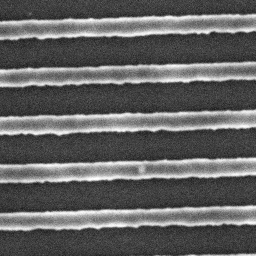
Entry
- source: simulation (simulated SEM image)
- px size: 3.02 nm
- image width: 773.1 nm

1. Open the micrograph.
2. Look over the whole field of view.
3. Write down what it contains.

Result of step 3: lines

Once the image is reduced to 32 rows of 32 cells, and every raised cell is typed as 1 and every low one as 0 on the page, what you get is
00000000000000000000000000000000
00000000000000000000000000000000
00000001111111111111111111111111
11111111111111111111111111111111
11111111110000000000000000000000
00000000000000000000000000000000
00000000000000000000000000000000
00000000000000000000000000000000
00000000001111111111111111111111
11111111111111111111111111111111
11111111010000000000000000000000
00000000000000000000000000000000
00000000000000000000000000000000
00000000000000000000000000000000
00000000011111111111111111111111
11111111111111111111111111111111
11111111111000000000000000000000
00000000000000000000000000000000
00000000000000000000000000000000
00000000000000000000000000000000
00000010111111111111111111111111
11111111111111111111111111111111
11111111111100000000000000000000
00000000000000000000000000000000
00000000000000000000000000000000
00000000000000000000000000000000
00000000011111111111111111111111
11111111111111111111111111111111
11111111111000000000000000000000
00000000000000000000000000000000
00000000000000000000000000000000
00000000000000000000000000000000